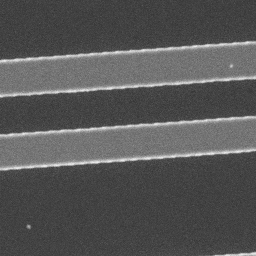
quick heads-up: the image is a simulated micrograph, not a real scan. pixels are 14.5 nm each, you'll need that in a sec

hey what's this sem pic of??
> lines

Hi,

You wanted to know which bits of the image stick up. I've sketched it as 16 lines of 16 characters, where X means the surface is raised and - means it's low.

----------------
----------------
----------------
----XXXXXXXXXXXX
XXXXXXXXXXXXXXXX
XXXXXXXX--------
----------------
------------XXXX
XXXXXXXXXXXXXXXX
XXXXXXXXXXXXXXX-
XX--------------
----------------
----------------
----------------
----------------
----------------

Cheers